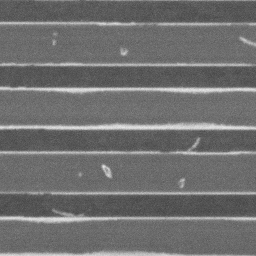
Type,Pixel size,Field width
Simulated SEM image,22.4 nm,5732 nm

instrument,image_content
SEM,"lines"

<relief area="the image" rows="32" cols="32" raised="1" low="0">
00000000000000000000000000000000
00000000000000000000000000000000
00000000000000000000000000000000
11111111111111111111111111111111
11111111111111111111111111111111
11111111111111111111111111111111
11111111111111111111111111111111
11111111111111111111111111111111
00000000000000000000000000000000
00000000000000000000000000000000
00000000000000000000000000000000
11111111111111111111111111111111
11111111111111111111111111111111
11111111111111111111111111111111
11111111111111111111111111111111
11111111111111111111111111111111
00000000000000000000000000000000
00000000000000000000000000000000
00000000000000000000000000000000
11111111111111111111111111111111
11111111111111111111111111111111
11111111111111111111111111111111
11111111111111111111111111111111
11111111111111111111111111111111
00000000000000000000000000000000
00000000000000000000000000000000
00000000000000000000000000000000
11111111111111111111111111111111
11111111111111111111111111111111
11111111111111111111111111111111
11111111111111111111111111111111
11111111111111111111111111111111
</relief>